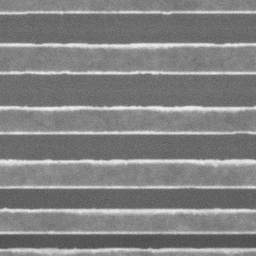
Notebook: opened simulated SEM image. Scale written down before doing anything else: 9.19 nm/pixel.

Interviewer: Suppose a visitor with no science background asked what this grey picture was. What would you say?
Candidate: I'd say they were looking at lines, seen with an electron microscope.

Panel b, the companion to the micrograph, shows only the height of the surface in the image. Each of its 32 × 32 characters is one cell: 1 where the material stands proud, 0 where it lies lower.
11111111111111111111111111111111
11111111111111111111111111111111
00000000000000000000000000000000
00000000000000000000000000000000
00000000000000000000000000000000
00000000000000000000000000000000
11111111111111111111111111111111
11111111111111111111111111111111
11111111111111111111111111111111
00000000000000000000000000000000
00000000000000000000000000000000
00000000000000000000000000000000
00000000000000000000000000000000
11111111111111111111111111111111
11111111111111111111111111111111
11111111111111111111111111111111
11111111111111111111111111111111
00000000000000000000000000000000
00000000000000000000000000000000
00000000000000000000000000000000
11111111111111111111111111111111
11111111111111111111111111111111
11111111111111111111111111111111
00000000000000000000000000000000
00000000000000000000000000000000
00000000000000000000000000000000
11111111111111111111111111111111
11111111111111111111111111111111
11111111111111111111111111111111
00000000000000000000000000000000
00000000000000000000000000000000
11111111111111111111111111111111